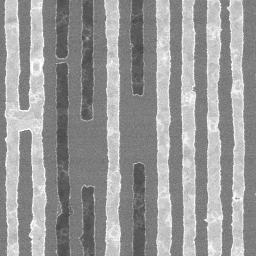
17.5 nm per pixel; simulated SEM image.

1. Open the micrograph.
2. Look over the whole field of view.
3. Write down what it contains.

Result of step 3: parallel lines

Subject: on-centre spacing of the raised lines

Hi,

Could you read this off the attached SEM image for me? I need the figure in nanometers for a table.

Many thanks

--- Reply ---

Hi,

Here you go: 437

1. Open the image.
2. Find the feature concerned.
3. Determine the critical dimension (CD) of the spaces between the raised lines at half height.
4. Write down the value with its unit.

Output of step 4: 228 nanometers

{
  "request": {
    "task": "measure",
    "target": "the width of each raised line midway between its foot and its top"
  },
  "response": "208 nm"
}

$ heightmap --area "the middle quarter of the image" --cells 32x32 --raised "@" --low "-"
@---@@@----@@@---@@@---@@@@---@@
@---@@@----@@@---@@@---@@@----@@
@---@@@----@@@---@@@---@@@----@@
@---@@@----@@@---@@@---@@@---@@@
@---@@@----@@@---@@@---@@@----@@
@---@@@----@@@---@@@---@@@----@@
@----@@----@@@---@@@---@@@----@@
@----@@----@@@---@@@---@@@----@@
@----@@----@@@---------@@@---@@@
@-----@----@@@----------@@---@@@
@---@@@----@@@---------@@@----@@
@---@@@----@@@----------@@----@@
@---@@@----@@----------@@@----@@
@---@@@----@@----------@@@----@@
@----------@@----------@@@----@@
@----------@@@---------@@@----@@
@----------@@@---------@@@----@@
@----------@@@---------@@@----@@
@----------@@@---------@@@----@@
@----------@@@---------@@@----@@
@----------@@@----------@@----@@
@----------@@@----------@@----@@
@----------@@@----------@@----@@
@----------@@@----------@@----@@
@----------@@@---------@@@----@@
@----------@@@---@@@---@@@----@@
@----------@@@---@@@----@@----@@
@----------@@@---@@@----@@----@@
@----------@@@---@@@----@@----@@
@----------@@@---@@@----@@----@@
@@---------@@@---@@@----@@----@@
@@--@@@@---@@@---@@@----@@----@@